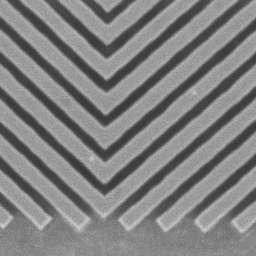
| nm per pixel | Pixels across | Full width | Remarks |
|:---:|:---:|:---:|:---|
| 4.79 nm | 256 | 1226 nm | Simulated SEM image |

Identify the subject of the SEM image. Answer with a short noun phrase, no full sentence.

groups of lines, slits or small figures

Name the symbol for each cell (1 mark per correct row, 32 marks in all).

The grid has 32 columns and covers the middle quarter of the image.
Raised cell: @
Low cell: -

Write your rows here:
@@@----@@@@@@@@----@@@@@@---@@@@
@@@@----@@@@@@----@@@@@----@@@@@
@@@@@----@@@----@@@@@@----@@@@@@
@@@@@@----@----@@@@@@----@@@@@@-
-@@@@@@-------@@@@@@----@@@@@@--
---@@@@@-----@@@@@@----@@@@@@---
----@@@@@---@@@@@@---@@@@@@----@
@----@@@@@@@@@@@@---@@@@@@----@@
@@----@@@@@@@@@----@@@@@@----@@@
@@@----@@@@@@@----@@@@@@---@@@@@
@@@@----@@@@@----@@@@@@---@@@@@@
@@@@@----@@@----@@@@@@----@@@@@-
-@@@@@----@----@@@@@-----@@@@@--
--@@@@@@-----@@@@@@----@@@@@@---
---@@@@@@---@@@@@@----@@@@@@----
----@@@@@@-@@@@@@----@@@@@@----@
@@---@@@@@@@@@@@----@@@@@@---@@@
@@@---@@@@@@@@@----@@@@@----@@@@
@@@@---@@@@@@@---@@@@@@----@@@@@
@@@@@---@@@@@---@@@@@@----@@@@@@
@@@@@@---@@----@@@@@@----@@@@@@-
-@@@@@@-------@@@@@@----@@@@@@--
--@@@@@@-----@@@@@@---@@@@@@----
---@@@@@@---@@@@@@---@@@@@@----@
@----@@@@@@@@@@@----@@@@@@----@@
@@---@@@@@@@@@@----@@@@@@----@@@
@@@---@@@@@@@@----@@@@@@----@@@@
@@@@---@@@@@@----@@@@@@---@@@@@@
@@@@@---@@@@----@@@@@----@@@@@@-
@@@@@@---@@----@@@@@----@@@@@@--
-@@@@@@------@@@@@@----@@@@@@---
--@@@@@@----@@@@@@----@@@@@@----